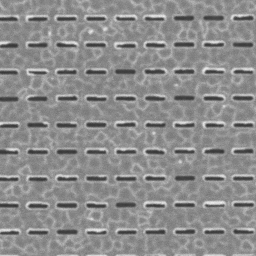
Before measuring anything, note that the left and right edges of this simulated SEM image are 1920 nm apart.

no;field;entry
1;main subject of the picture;a regular array of holes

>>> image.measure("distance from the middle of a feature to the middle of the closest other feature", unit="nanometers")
198